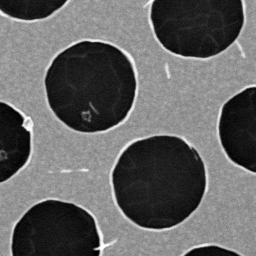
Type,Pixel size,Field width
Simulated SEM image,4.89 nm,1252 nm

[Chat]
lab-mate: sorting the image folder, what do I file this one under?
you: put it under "holes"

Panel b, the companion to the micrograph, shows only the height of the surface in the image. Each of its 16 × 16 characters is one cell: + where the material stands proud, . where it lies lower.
....+++++......+
++++++++++.....+
++++++++++.....+
++++....+++..+++
+++.....++++++++
+++.....++++++++
+++.....++++++..
.+++....++++++..
..++++++++.+++..
..++++++....++..
.++++++......++.
+++++++......+++
+++++++......+++
+.....++....++++
+.....++++++++++
+.....++++++..++